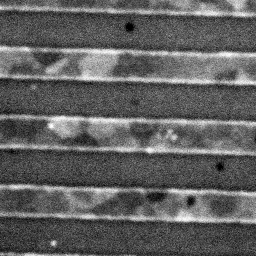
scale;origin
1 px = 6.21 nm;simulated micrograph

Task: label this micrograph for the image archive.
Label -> lines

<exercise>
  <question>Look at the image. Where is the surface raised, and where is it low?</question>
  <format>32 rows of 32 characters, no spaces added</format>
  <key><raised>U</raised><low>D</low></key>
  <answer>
UUUUUUUUUUUUUUUUUUUUUUUUUUUUUUUU
DDDDDDDDDDDDDDDUUUUUUUUUUUUUUUUU
DDDDDDDDDDDDDDDDDDDDDDDDDDDDDDDD
DDDDDDDDDDDDDDDDDDDDDDDDDDDDDDDD
DDDDDDDDDDDDDDDDDDDDDDDDDDDDDDDD
DDDDDDDDDDDDDDDDDDDDDDDDDDDDDDDD
UUUUUUUUUUUUUUUUUDDDDDDDDDDDDDDD
UUUUUUUUUUUUUUUUUUUUUUUUUUUUUUUU
UUUUUUUUUUUUUUUUUUUUUUUUUUUUUUUU
UUUUUUUUUUUUUUUUUUUUUUUUUUUUUUUU
DDDDDDDDDDDDDDDDDDDDDDDDDDDDDDDD
DDDDDDDDDDDDDDDDDDDDDDDDDDDDDDDD
DDDDDDDDDDDDDDDDDDDDDDDDDDDDDDDD
DDDDDDDDDDDDDDDDDDDDDDDDDDDDDDDD
DDDDDDDDDDDDDDDDDDDDDDDDDDDDDDDD
UUUUUUUUUUUUUUUUUUUUUUUUUUUUUUUU
UUUUUUUUUUUUUUUUUUUUUUUUUUUUUUUU
UUUUUUUUUUUUUUUUUUUUUUUUUUUUUUUU
DDDDDDUUUUUUUUUUUUUUUUUUUUUUUUUU
DDDDDDDDDDDDDDDDDDDDDDDDDDDDDDDD
DDDDDDDDDDDDDDDDDDDDDDDDDDDDDDDD
DDDDDDDDDDDDDDDDDDDDDDDDDDDDDDDD
DDDDDDDDDDDDDDDDDDDDDDDDDDDDDDDD
UUUUUUUDDDDDDDDDDDDDDDDDDDDDDDDD
UUUUUUUUUUUUUUUUUUUUUUUUUUUUUUUU
UUUUUUUUUUUUUUUUUUUUUUUUUUUUUUUU
UUUUUUUUUUUUUUUUUUUUUUUUUUUUUUUU
DDDDDDDDDDDDDDDDDDDDDDDUUUUUUUUU
DDDDDDDDDDDDDDDDDDDDDDDDDDDDDDDD
DDDDDDDDDDDDDDDDDDDDDDDDDDDDDDDD
DDDDDDDDDDDDDDDDDDDDDDDDDDDDDDDD
DDDDDDDDDDDDDDDDDDDDDDDDDDDDDDDD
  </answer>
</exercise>